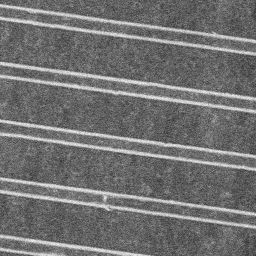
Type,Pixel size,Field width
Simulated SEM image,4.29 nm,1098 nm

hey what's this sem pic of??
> parallel lines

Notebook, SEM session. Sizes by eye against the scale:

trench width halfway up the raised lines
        187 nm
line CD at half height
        58.4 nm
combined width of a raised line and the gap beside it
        245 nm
